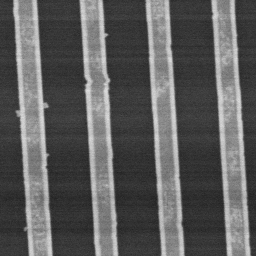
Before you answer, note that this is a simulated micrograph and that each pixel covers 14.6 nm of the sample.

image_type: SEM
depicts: one or a few lines or trenches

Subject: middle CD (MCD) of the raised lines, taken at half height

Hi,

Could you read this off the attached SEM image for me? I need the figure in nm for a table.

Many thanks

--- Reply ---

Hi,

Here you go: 288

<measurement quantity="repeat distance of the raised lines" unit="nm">964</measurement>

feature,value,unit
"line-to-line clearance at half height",680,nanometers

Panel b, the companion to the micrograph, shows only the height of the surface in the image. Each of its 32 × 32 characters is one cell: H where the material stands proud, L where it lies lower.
LLHHLLLLLLHHHLLLLLLHHLLLLLLHHLLL
LLHHLLLLLLHHHLLLLLLHHLLLLLLHHLLL
LLHHLLLLLLHHHLLLLLLHHLLLLLLHHLLL
LLHHHLLLLLHHHLLLLLLHHLLLLLLHHLLL
LLHHHLLLLLLHHLLLLLLHHLLLLLLHHLLL
LLHHHLLLLLLHHLLLLLLHHLLLLLLHHLLL
LLHHHLLLLLLHHLLLLLLHHLLLLLLHHLLL
LLHHHLLLLLLHHLLLLLLHHLLLLLLHHLLL
LLHHHLLLLLLHHLLLLLLHHLLLLLLHHHLL
LLLHHLLLLLLHHLLLLLLHHLLLLLLHHHLL
LLLHHLLLLLLHHLLLLLLHHLLLLLLHHHLL
LLLHHLLLLLLHHLLLLLLHHHLLLLLHHHLL
LLLHHLLLLLLHHLLLLLLHHHLLLLLLHHLL
LLLHHLLLLLLHHLLLLLLHHHLLLLLLHHLL
LLLHHLLLLLLHHLLLLLLHHHLLLLLLHHLL
LLLHHLLLLLLHHLLLLLLHHHLLLLLLHHLL
LLLHHLLLLLLHHHLLLLLLHHLLLLLLHHLL
LLLHHLLLLLLHHHLLLLLLHHLLLLLLHHLL
LLLHHLLLLLLHHHLLLLLLHHLLLLLLHHLL
LLLHHHLLLLLHHHLLLLLLHHLLLLLLHHLL
LLLHHHLLLLLHHHLLLLLLHHLLLLLLHHLL
LLLHHHLLLLLLHHLLLLLLHHLLLLLLHHLL
LLLHHHLLLLLLHHLLLLLLHHLLLLLLHHLL
LLLHHHLLLLLLHHLLLLLLHHLLLLLLHHHL
LLLHHHLLLLLLHHLLLLLLHHLLLLLLHHHL
LLLLHHLLLLLLHHLLLLLLHHLLLLLLHHHL
LLLLHHLLLLLLHHLLLLLLHHLLLLLLHHHL
LLLLHHLLLLLLHHLLLLLLHHLLLLLLHHHL
LLLLHHLLLLLLHHLLLLLLHHHLLLLLHHHL
LLLLHHLLLLLLHHLLLLLLHHHLLLLLLHHL
LLLLHHLLLLLLHHLLLLLLHHHLLLLLLHHL
LLLLHHLLLLLLHHLLLLLLHHHLLLLLLHHL